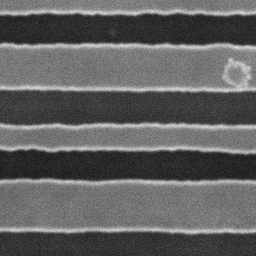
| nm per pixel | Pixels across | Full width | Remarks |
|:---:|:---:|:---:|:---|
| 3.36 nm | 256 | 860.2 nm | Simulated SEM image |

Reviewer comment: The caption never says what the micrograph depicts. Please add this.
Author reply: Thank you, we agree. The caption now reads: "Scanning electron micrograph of lines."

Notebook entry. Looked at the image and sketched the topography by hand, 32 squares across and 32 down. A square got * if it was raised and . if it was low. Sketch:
********************************
********************************
................................
................................
................................
*...............................
********************************
********************************
********************************
********************************
********************************
................................
................................
................................
................................
................................
********************************
********************************
********************************
................................
................................
................................
...*.*..........................
********************************
********************************
********************************
********************************
********************************
********************************
................................
................................
................................